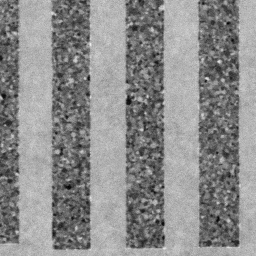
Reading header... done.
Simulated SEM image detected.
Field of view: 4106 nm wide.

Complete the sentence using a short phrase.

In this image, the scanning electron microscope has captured one or a few lines or trenches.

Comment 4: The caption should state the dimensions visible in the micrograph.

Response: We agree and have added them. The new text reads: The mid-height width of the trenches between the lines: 33.9 px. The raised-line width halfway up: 622 nm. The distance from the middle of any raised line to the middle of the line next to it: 1180 nm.